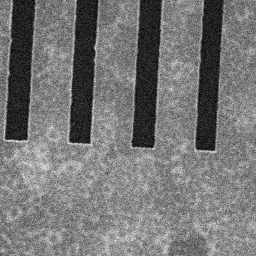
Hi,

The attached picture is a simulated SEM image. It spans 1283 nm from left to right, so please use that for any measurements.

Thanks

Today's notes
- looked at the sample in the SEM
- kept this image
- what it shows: one or a few lines or trenches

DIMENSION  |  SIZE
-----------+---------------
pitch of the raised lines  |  0.318 micrometres